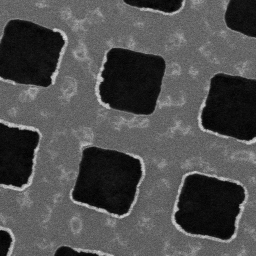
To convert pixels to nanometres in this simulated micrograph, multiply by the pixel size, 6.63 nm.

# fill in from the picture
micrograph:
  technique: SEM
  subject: holes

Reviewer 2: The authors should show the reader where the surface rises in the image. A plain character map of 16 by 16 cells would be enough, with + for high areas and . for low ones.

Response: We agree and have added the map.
+++++++++..+++..
+.++++++++++++..
....++++++++++++
....+++...++++++
...+++....++++++
++++++....+++...
+++++++...+++...
+++++++++++++...
..++++++++++++..
..+++..+++++++++
..+++....+++++++
.++++....++....+
+++++...+++....+
+++++++++++....+
++++++++++++...+
.+++++++++++++++